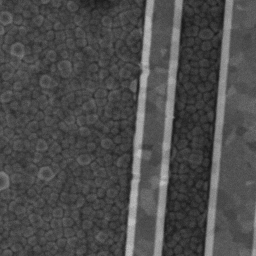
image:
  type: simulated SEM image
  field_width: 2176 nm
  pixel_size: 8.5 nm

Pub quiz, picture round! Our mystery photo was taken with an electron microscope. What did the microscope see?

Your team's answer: one or a few lines or trenches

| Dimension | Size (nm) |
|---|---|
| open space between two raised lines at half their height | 427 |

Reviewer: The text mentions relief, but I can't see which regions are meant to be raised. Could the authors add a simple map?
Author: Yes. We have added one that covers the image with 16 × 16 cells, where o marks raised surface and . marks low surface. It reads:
.........oo...oo
.........oo...oo
.........oo...oo
.........oo...oo
.........oo...oo
.........oo...oo
.........oo...oo
.........oo...oo
.........oo...oo
.........o....oo
........oo...ooo
........oo...ooo
........oo...ooo
........oo...ooo
........oo...ooo
........oo...ooo